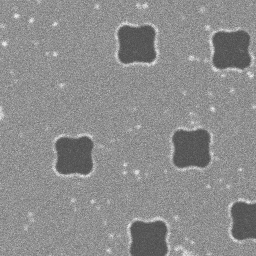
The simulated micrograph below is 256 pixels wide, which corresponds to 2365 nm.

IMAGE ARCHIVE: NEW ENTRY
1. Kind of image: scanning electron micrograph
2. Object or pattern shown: holes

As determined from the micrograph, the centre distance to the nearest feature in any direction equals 931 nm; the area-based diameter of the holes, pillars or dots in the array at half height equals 383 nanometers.